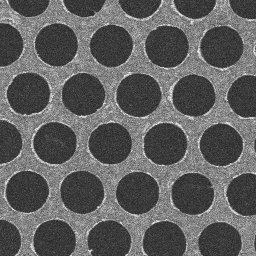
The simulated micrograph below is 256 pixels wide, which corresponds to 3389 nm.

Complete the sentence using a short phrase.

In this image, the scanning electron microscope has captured a regular array of holes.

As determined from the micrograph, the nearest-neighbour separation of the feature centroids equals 0.728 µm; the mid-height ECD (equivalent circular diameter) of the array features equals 566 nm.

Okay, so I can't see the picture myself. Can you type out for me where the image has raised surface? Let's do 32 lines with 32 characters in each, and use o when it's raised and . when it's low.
o.....oo.....oo.....oo.....oo...
oo...oooo...oooo...ooo....ooo...
oooooooooooooooooooooooooooooooo
..ooo....oooo..ooooo..ooooo..ooo
...oo....ooo....oo.....ooo....oo
...o......o......o......o.....oo
...oo.....o.....oo.....oo.....oo
..ooo....ooo....ooo....ooo....oo
oooooooooooooooooooooooooooooooo
oo...oooo...oooo...oooo..ooooo..
o.....oo.....oo.....oo....ooo...
o.....oo.....oo.....oo.....oo...
o.....oo.....oo.....oo.....o....
oo....oo....ooo.....oo....ooo...
ooooooooooooooooo.oooooo.ooooo..
.ooooo..ooooo..ooooo..ooooo.oooo
..ooo....ooo....oo.....ooo....oo
...o......o.....oo.....oo.....oo
...o......o.....oo.....oo.....oo
..ooo....ooo....oo.....oo.....oo
ooooooooooooo..ooooo.oooooo..ooo
ooo.ooooo..ooooooooooooooooooooo
o.....oo....ooo....ooo....ooo...
o.....oo.....oo.....oo.....oo...
o.....oo.....oo.....o......o....
o.....oo.....oo....ooo....ooo...
ooo.ooooo...oooo..ooooo..ooooo..
oooooooooooooooooooooooooooooooo
..ooo....ooo....ooo....ooo...ooo
..oo.....oo.....oo.....oo.....oo
...o.....oo.....oo.....oo.....oo
..oo.....oo.....oo.....oo.....oo